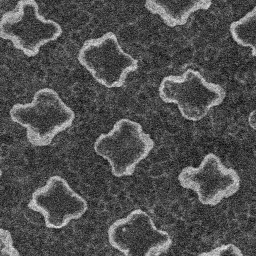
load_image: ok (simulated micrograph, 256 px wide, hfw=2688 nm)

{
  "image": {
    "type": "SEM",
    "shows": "raised bodies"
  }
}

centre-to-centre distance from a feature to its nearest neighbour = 888 nanometres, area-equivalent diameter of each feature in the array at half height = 0.497 um